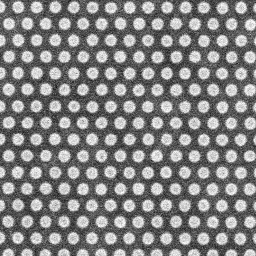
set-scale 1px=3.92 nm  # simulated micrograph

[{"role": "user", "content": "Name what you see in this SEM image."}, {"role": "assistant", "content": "a regular array of raised bodies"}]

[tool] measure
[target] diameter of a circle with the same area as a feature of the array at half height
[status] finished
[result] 43.1 nanometers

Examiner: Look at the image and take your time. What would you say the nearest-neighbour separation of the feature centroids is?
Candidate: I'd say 71.5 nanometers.